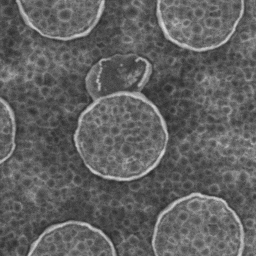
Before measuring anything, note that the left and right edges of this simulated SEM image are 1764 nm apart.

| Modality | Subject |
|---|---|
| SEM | raised bodies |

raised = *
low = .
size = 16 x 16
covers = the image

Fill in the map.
.*****....*****.
..****....*****.
...........***..
................
................
................
......***.......
*....*****......
*....*****......
*....*****......
......****......
................
...........***..
..........*****.
...***....*****.
..*****...*****.